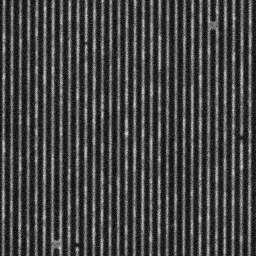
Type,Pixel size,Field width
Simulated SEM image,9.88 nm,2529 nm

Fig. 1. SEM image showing parallel lines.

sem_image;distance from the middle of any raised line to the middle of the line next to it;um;0.0811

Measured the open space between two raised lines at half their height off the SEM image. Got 6.62 pixels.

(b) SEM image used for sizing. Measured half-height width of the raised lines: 16.1 nm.